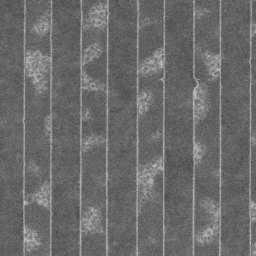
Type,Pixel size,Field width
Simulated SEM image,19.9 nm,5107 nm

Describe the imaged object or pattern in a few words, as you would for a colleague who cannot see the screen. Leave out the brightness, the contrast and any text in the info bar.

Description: parallel lines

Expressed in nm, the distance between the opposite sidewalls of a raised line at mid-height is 596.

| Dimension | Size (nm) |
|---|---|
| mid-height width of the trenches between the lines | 528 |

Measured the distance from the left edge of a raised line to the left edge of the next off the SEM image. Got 1.13 um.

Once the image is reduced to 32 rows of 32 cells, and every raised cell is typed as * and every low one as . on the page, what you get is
***...****....***....***....***.
***...****....***....***....***.
***...****....***....***....***.
***...****....***....***....***.
***...****....***....***....***.
***...****....***....***....***.
***...****....***....***....***.
***...****....***...****....***.
***...****...****...****....***.
***...****...****...****....***.
***...****...****...*****...***.
***...****...****....***....***.
***...****...****....***....***.
***...****...****....***....***.
***...****...****....***....***.
***...****...****....***....***.
***...****...****....***....***.
***...****...****....***....***.
***...****...****....***....***.
***...****...****...****....***.
***...****...****...****....***.
***...****...****...****....***.
***...****...****...****....***.
***...****...****....***....***.
***...****...****....***....***.
***...****...****....***....***.
***...****...****....***....***.
***...****...****....***....***.
***...****...****....***....***.
***...****...****....***....***.
***...****...****....***....***.
***...****...****....***...****.